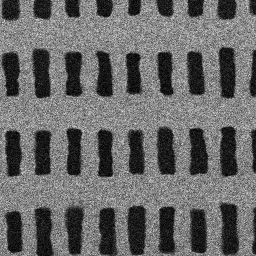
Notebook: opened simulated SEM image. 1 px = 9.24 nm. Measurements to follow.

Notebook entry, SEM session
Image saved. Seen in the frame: a regular array of holes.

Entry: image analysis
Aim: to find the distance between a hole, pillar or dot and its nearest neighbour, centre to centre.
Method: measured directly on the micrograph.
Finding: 30.2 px